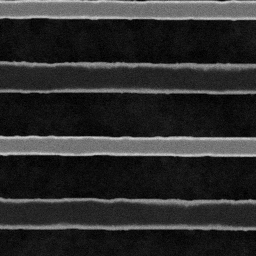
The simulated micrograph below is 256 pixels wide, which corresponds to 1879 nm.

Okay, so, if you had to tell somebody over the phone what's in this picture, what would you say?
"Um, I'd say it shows lines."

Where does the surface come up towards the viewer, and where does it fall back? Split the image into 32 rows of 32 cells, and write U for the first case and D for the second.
UUUUUUUUUUUUUUUUUUUUUUUUUUUUUUUU
UUUUUUUUUUUUUUUUUUUUUUUUUUUUUUUU
DDDDDDDDDDDDDDDDDDDDDDDDDDDDDUDD
DDDDDDDDDDDDDDDDDDDDDDDDDDDDDDDD
DDDDDDDDDDDDDDDDDDDDDDDDDDDDDDDD
DDDDDDDDDDDDDDDDDDDDDDDDDDDDDDDD
DDDDDDDDDDDDDDDDDDDDDDDDDDDDDDDD
DDDDDDDDDDDDDDDDDDDDDDDDDDDDDDDD
UUUUUUUUUUUUUUUUUUUUUUUUUUUUUUUU
UUUUUUUUUUUUUUUUUUUUUUUUUUUUUUUU
UUUUUUUUUUUUUUUUUUUUUUUUUUUUUUUU
UUUUUUUUUUUUUUUUUUUUUUUUUUUUUUUU
DDDDDDDDDDDDDDDDDDDDDDDDDDDDDDDD
DDDDDDDDDDDDDDDDDDDDDDDDDDDDDDDD
DDDDDDDDDDDDDDDDDDDDDDDDDDDDDDDD
DDDDDDDDDDDDDDDDDDDDDDDDDDDDDDDD
DDDDDDDDDDDDDDDDDDDDDDDDDDDDDDDD
UUUUUUUUUUUUUUUUUUUUUUUUUUUUUUUU
UUUUUUUUUUUUUUUUUUUUUUUUUUUUUUUU
DDDDDDDDDDDDDDDDDDDDDDUUUUUUUUUU
DDDDDDDDDDDDDDDDDDDDDDDDDDDDDDDD
DDDDDDDDDDDDDDDDDDDDDDDDDDDDDDDD
DDDDDDDDDDDDDDDDDDDDDDDDDDDDDDDD
DDDDDDDDDDDDDDDDDDDDDDDDDDDDDDDD
DDDDDDDDDDDDDDDDDDDDDDDDDDDDDDDD
UUUUUUUUUUUUUUUUUUUUUUUUUUUUUUUU
UUUUUUUUUUUUUUUUUUUUUUUUUUUUUUUU
UUUUUUUUUUUUUUUUUUUUUUUUUUUUUUUU
UUUUUUUUUUUUUUUUUUUUUUUUUUUUUUUU
DDDDDDDDDDDDDDDDDDDDDDDDDDDDDDDD
DDDDDDDDDDDDDDDDDDDDDDDDDDDDDDDD
DDDDDDDDDDDDDDDDDDDDDDDDDDDDDDDD